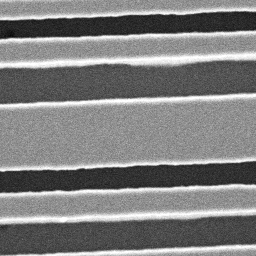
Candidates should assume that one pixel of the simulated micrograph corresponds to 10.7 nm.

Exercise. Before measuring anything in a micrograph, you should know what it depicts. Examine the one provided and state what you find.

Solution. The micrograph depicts lines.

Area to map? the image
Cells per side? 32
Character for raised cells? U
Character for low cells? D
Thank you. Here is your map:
UUUUUUUUUUUUUUUUUUUUUUUUUUUUUUUU
UUUUUUUUUUUUUUUUUUUUUUUUUUDDDDDD
DDDDDDDDDDDDDDDDDDDDDDDDDDDDDDDD
DDDDDDDDDDDDDDDDDDDDDDDDDDDDDDDD
DDDDDDDDDDDDDDDDUUUUUUUUUUUUUUUU
UUUUUUUUUUUUUUUUUUUUUUUUUUUUUUUU
UUUUUUUUUUUUUUUUUUUUUUUUUUUUUUUU
UUUUUUUUUUUUUUUUUUUDDDDDDDDDDDDD
DDDDDDDDDDDDDDDDDDDDDDDDDDDDDDDD
DDDDDDDDDDDDDDDDDDDDDDDDDDDDDDDD
DDDDDDDDDDDDDDDDDDDDDDDDDDDDDDDD
DDDDDDDDDDDDDDDDDDDDDDDDDDDDDDDD
DDDDDDDDDDDDDDDDDDDUUUUUUUUUUUUU
UUUUUUUUUUUUUUUUUUUUUUUUUUUUUUUU
UUUUUUUUUUUUUUUUUUUUUUUUUUUUUUUU
UUUUUUUUUUUUUUUUUUUUUUUUUUUUUUUU
UUUUUUUUUUUUUUUUUUUUUUUUUUUUUUUU
UUUUUUUUUUUUUUUUUUUUUUUUUUUUUUUU
UUUUUUUUUUUUUUUUUUUUUUUUUUUUUUUU
UUUUUUUUUUUUUUUUUUUUUUUUUUUUUUUU
UUUUUUUUUUUUUUUUUUUUDUUDDDDDDDDD
DDDDDDDDDDDDDDDDDDDDDDDDDDDDDDDD
DDDDDDDDDDDDDDDDDDDDDDDDDDDDDDDD
DDDDDDDDDDDDDDDDDDDDDUUUUUUUUUUU
UUUUUUUUUUUUUUUUUUUUUUUUUUUUUUUU
UUUUUUUUUUUUUUUUUUUUUUUUUUUUUUUU
UUUUUUUUUUUUUUUUUUUUUUUUUUUUUUDD
UUDDDDDUDDDDDDDDDDDDDDDDDDDDDDDD
DDDDDDDDDDDDDDDDDDDDDDDDDDDDDDDD
DDDDDDDDDDDDDDDDDDDDDDDDDDDDDDDD
DDDDDDDDDDDDDDDDDDDDDDDDDDDDDDDD
DDDDDDDDDDDDDDUUUUUUUUUUUUUUUUUU